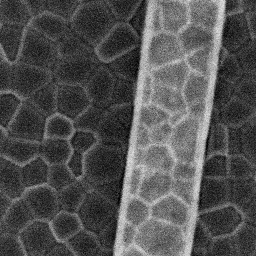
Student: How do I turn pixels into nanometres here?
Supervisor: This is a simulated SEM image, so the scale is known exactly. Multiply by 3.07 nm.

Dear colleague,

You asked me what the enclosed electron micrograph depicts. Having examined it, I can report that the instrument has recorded one or a few lines or trenches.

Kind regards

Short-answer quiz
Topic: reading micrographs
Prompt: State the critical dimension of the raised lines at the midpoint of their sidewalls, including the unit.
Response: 215 nm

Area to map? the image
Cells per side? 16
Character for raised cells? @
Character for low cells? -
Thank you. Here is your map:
---------@@@@@--
---------@@@@@--
---------@@@@@--
---------@@@@---
---------@@@@---
---------@@@@---
---------@@@@---
--------@@@@@---
--------@@@@@---
--------@@@@@---
--------@@@@----
--------@@@@----
--------@@@@----
--------@@@@----
--------@@@@----
-------@@@@@----